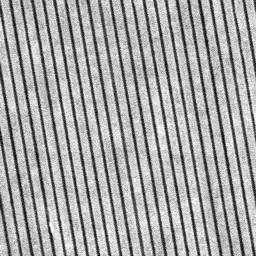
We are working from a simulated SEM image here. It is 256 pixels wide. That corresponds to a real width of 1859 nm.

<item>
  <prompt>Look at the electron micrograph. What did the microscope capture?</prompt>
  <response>parallel lines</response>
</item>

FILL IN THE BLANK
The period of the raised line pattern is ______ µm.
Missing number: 0.0796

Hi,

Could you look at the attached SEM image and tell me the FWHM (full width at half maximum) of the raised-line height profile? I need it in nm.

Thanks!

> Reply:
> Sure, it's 55.4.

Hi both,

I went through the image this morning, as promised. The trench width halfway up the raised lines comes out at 0.0278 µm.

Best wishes